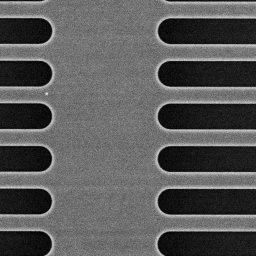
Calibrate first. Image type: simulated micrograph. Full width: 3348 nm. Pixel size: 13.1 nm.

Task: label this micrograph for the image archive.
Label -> groups of lines, slits or small figures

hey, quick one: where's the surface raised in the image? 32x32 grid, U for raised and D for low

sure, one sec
UUUUUUUUUUUUUUUUUUUUUUUUUUUUUUUU
UUUUUUUUUUUUUUUUUUUUUUUUUUUUUUUU
DDDDDDUUUUUUUUUUUUUUUDDDDDDDDDDD
DDDDDDDUUUUUUUUUUUUUDDDDDDDDDDDD
DDDDDDUUUUUUUUUUUUUUDDDDDDDDDDDD
DDDDDUUUUUUUUUUUUUUUUDDDDDDDDDDD
UUUUUUUUUUUUUUUUUUUUUUUUUUUUUUUU
DDDDDUUUUUUUUUUUUUUUUUDUUUUUUUUU
DDDDDDUUUUUUUUUUUUUUDDDDDDDDDDDD
DDDDDDUUUUUUUUUUUUUUDDDDDDDDDDDD
DDDDDDUUUUUUUUUUUUUUDDDDDDDDDDDD
UUUUUUUUUUUUUUUUUUUUUUUUUUUUUUUU
UUUUUUUUUUUUUUUUUUUUUUUUUUUUUUUU
DDDDDDUUUUUUUUUUUUUUDDDDDDDDDDDD
DDDDDDDUUUUUUUUUUUUUDDDDDDDDDDDD
DDDDDDUUUUUUUUUUUUUUDDDDDDDDDDDD
UUUUUUUUUUUUUUUUUUUUUUUUUUUUUUUU
UUUUUUUUUUUUUUUUUUUUUUUUUUUUUUUU
DDDDDDUUUUUUUUUUUUUUUDDDDDDDDDDD
DDDDDDUUUUUUUUUUUUUUDDDDDDDDDDDD
DDDDDDUUUUUUUUUUUUUUDDDDDDDDDDDD
DDDDDUUUUUUUUUUUUUUUUDDDDDDDDDDD
UUUUUUUUUUUUUUUUUUUUUUUUUUUUUUUU
DDUUUUUUUUUUUUUUUUUUUUUUUUUUUUUU
DDDDDDUUUUUUUUUUUUUUDDDDDDDDDDDD
DDDDDDUUUUUUUUUUUUUUDDDDDDDDDDDD
DDDDDDUUUUUUUUUUUUUUDDDDDDDDDDDD
UUUUUUUUUUUUUUUUUUUUUUUUUUUUUUUU
UUUUUUUUUUUUUUUUUUUUUUUUUUUUUUUU
DDDDDDUUUUUUUUUUUUUUDDDDDDDDDDDD
DDDDDDDUUUUUUUUUUUUUDDDDDDDDDDDD
DDDDDDUUUUUUUUUUUUUUDDDDDDDDDDDD